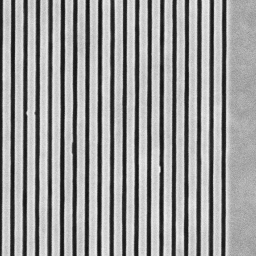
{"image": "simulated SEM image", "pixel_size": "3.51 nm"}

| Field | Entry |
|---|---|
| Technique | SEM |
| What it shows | parallel lines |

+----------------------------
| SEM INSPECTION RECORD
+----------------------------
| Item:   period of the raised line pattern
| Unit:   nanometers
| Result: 43.6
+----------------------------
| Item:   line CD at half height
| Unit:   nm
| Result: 29.8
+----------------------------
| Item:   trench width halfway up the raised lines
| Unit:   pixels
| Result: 3.87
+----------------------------